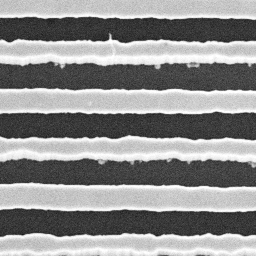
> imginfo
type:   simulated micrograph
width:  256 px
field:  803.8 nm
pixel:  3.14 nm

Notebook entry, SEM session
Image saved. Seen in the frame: lines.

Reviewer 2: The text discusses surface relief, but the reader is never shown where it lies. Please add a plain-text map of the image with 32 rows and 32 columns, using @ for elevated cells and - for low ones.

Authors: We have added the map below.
@@@@@@@@@@@@@@@@@@@@@@@@@@@@@@@@
@@@@@@@@@@@@@@@@@@@@@@@@@@@@@@@@
--------------------------------
--------------------------------
--------------------------------
@@@@@@@@@@@@@@@@@@@@@@@@@@@@@@@@
@@@@@@@@@@@@@@@@@@@@@@@@@@@@@@@@
@@@@@--@@@@-@@@@@@@@-@------@@@@
--------------------------------
--------------------------------
--------------------------------
@@@@@@@@@@@@@@@@@@@@@@@@@@@@@@@@
@@@@@@@@@@@@@@@@@@@@@@@@@@@@@@@@
@@@@@@@@@@@@@@@@@@@@@@@@@@@@@@@@
--------------------------------
--------------------------------
--------------------------------
@@@@@@@@@@@@@@@@@@@@@@@@-@@@@@@-
@@@@@@@@@@@@@@@@@@@@@@@@@@@@@@@@
@@--@@@@@@@@@@@@@@@@@-@@@@@@@@@@
--------------------------------
--------------------------------
--------------------------------
@@@@@@@@@@@@@@@@@@@@@@@@@@@@@@@@
@@@@@@@@@@@@@@@@@@@@@@@@@@@@@@@@
@@@@@@@@@@@@@@@@@@@@@@@@@@@@@@@@
--------------------------------
--------------------------------
--------------------------------
-@@@@@@--@@@@@@@@@@@@@@-@@@@@@-@
@@@@@@@@@@@@@@@@@@@@@@@@@@@@@@@@
@@@@@@@@@@@@@@@@@@@@@@@@@@@@@@@@